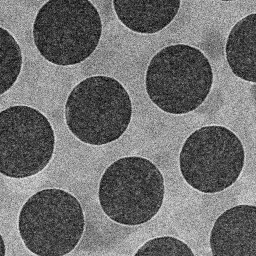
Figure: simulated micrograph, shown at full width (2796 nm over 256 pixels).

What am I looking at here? holes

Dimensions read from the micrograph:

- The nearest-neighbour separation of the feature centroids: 931 nm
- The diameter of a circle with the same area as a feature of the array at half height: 733 nanometers